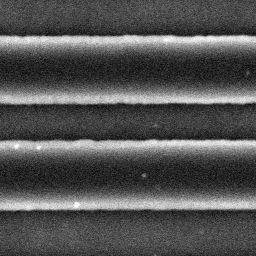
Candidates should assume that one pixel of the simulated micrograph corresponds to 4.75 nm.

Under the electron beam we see lines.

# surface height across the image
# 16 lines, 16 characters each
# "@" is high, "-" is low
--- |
----------------
----------------
@@@@@@@@@@@@@@@@
@@@@@@@@@@@@@@@@
@@@@@@@@@@@@@@@@
@@@@@@@@@@@@@@@@
----------------
----------------
----------------
@@@@@@@@@@@@@@@@
@@@@@@@@@@@@@@@@
@@@@@@@@@@@@@@@@
@@@@@@@@@@@@@@@@
----------------
----------------
----------------